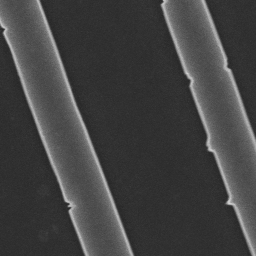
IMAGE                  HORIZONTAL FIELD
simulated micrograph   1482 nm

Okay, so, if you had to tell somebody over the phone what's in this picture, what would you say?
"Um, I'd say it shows one or a few lines or trenches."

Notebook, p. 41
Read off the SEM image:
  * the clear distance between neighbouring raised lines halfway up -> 655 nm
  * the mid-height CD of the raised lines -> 0.249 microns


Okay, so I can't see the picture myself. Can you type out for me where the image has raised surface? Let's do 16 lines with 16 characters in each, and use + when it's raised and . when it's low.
+++.......+++...
+++........++...
+++........+++..
.+++.......+++..
.+++........++..
.+++........+++.
..+++.......+++.
..+++........++.
...+++.......+++
...+++.......+++
...+++........++
....+++.......++
....+++.......++
....+++........+
.....+++.......+
.....+++........